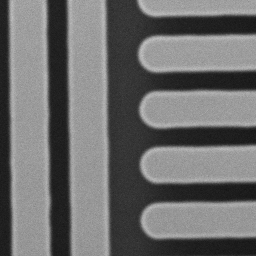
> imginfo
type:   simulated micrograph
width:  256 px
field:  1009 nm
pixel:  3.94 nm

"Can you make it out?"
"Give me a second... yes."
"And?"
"groups of lines, slits or small figures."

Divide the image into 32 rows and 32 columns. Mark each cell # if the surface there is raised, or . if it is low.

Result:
.#####...####....###############
.#####...####.....##############
.#####...####...................
.#####...####...................
.#####...####.............######
.#####...####.....##############
.#####...####....###############
.#####...####....###############
.#####...####.....##############
.#####...####...................
.#####...####...................
.#####...####..........#########
.#####...####.....##############
.#####...####....###############
.#####...####.....##############
.#####...####.....##############
.#####...####...................
.#####...####...................
.#####...####......#############
.#####...####.....##############
.#####...####.....##############
.#####...####.....##############
..####...####......#############
.#####...####...................
.#####...####...................
.#####...####......#############
..####...####.....##############
..####...####.....##############
..####...####.....##############
..####...####......#############
..####...#####..................
..####...#####..................